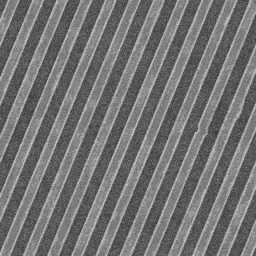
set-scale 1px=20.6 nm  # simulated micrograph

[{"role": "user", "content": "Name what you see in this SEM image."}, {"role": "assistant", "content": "parallel lines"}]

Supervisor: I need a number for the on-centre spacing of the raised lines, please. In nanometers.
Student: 460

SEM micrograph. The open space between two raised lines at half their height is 278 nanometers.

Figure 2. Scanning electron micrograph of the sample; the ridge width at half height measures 190 nanometers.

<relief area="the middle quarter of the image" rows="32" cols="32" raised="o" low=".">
....oo....oo....oo....oo....oo..
...ooo...ooo...ooo...ooo...ooo..
...oo....oo....oo....oo....oo...
...oo...ooo....oo....oo....oo...
..oo....oo....oo....oo....oo....
..oo....oo....oo....oo....oo....
.oo....ooo...ooo...ooo...ooo...o
.oo....oo....oo....oo....oo....o
ooo...ooo....oo...ooo....oo....o
oo....oo....oo....oo....oo....oo
oo....oo....oo....oo....oo....oo
o....oo....oo....ooo...ooo...ooo
o....oo....oo....oo....oo....oo.
o...ooo...ooo...ooo....oo...ooo.
....oo....oo....oo....oo....oo..
...ooo....oo....oo....oo....oo..
...oo....oo....ooo...oo....ooo..
...oo....oo....oo....oo....oo...
..ooo...ooo...ooo...ooo...ooo...
..oo....oo....oo....oo....oo....
.ooo....oo...ooo....oo....oo....
.oo....oo....oo....oo....ooo...o
.oo....oo....oo....oo....oo....o
ooo...oo....oo....ooo...ooo...oo
oo....oo....oo....oo....oo....oo
oo...ooo...ooo....oo...ooo....oo
o....oo....oo....oo....oo....oo.
o....oo....oo....oo....oo....oo.
....oo....ooo...ooo...ooo...ooo.
....oo....oo....oo....oo....oo..
...ooo...ooo...ooo...ooo....oo..
...oo....oo....oo....oo....oo...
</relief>